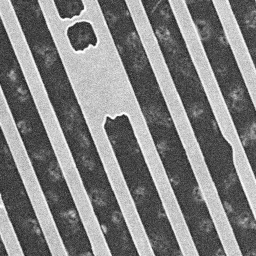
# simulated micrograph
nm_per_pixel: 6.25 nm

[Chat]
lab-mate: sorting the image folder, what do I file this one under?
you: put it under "parallel lines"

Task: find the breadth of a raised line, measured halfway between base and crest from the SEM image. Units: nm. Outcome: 83.4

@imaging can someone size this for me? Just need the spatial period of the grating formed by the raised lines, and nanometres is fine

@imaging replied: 254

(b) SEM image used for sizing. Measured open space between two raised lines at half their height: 172 nm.